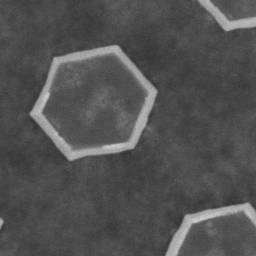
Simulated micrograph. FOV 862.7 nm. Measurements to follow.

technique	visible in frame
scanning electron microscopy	raised bodies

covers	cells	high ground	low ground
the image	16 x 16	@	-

-------------@@@
--------------@@
----------------
-----@@@--------
---@@@@@@-------
---@@@@@@-------
--@@@@@@@-------
--@@@@@@@-------
---@@@@@@-------
----@@----------
----------------
----------------
----------------
------------@@@@
-----------@@@@@
-----------@@@@@